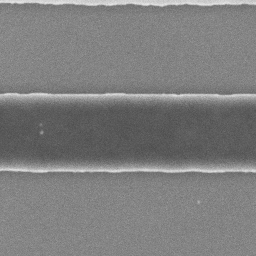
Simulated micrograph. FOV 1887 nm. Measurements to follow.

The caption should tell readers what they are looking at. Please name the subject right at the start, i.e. lines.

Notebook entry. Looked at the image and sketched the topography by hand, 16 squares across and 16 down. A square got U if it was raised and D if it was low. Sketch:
DDDDDDDDDDDDDDDD
DDDDDDDDDDDDDDDD
DDDDDDDDDDDDDDDD
DDDDDDDDDDDDDDDD
DDDDDDDDDDDDDDDD
DDDDDDDDDDDDDDDD
UUUUUUUUUUUUUUUU
UUUUUUUUUUUUUUUU
UUUUUUUUUUUUUUUU
UUUUUUUUUUUUUUUU
UUUUUUUUUUUUUUUU
DDDDDDDDDDDDDDDD
DDDDDDDDDDDDDDDD
DDDDDDDDDDDDDDDD
DDDDDDDDDDDDDDDD
DDDDDDDDDDDDDDDD